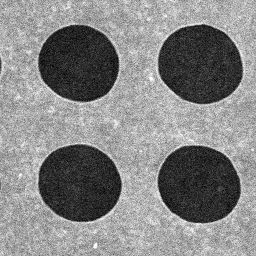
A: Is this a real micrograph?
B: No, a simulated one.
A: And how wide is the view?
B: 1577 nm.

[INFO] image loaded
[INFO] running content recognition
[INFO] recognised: holes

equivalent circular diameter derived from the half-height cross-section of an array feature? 495 nm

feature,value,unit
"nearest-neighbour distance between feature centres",736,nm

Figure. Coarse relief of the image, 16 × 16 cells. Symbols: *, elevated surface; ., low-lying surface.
****************
****************
***....***....**
**.....***.....*
**.....***.....*
***....****....*
****************
****************
****************
***...*****...**
***....***.....*
**......**.....*
***....***.....*
****..*****...**
****************
****************